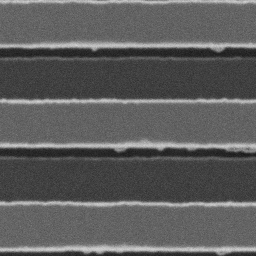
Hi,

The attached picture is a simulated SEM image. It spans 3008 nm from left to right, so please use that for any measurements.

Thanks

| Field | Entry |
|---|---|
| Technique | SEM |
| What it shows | lines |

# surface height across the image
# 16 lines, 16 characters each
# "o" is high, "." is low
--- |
oooooooooooooooo
oooooooooooooooo
oooooooooooooooo
................
................
................
oooooooooooooooo
oooooooooooooooo
oooooooooooooooo
................
................
................
................
oooooooooooooooo
oooooooooooooooo
oooooooooooooooo